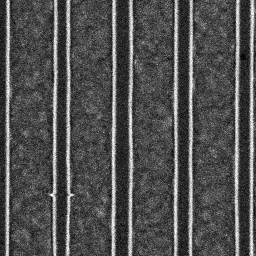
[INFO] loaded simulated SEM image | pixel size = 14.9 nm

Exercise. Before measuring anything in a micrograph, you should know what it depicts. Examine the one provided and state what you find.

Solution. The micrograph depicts one or a few lines or trenches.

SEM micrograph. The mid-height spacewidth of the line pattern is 0.68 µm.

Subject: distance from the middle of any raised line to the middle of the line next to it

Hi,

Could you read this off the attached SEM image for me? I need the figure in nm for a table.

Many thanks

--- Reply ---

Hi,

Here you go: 910